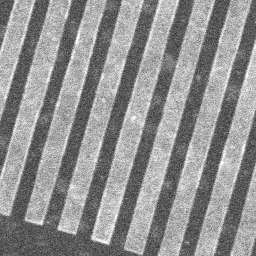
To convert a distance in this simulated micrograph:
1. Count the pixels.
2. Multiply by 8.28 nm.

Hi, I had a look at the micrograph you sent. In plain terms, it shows parallel lines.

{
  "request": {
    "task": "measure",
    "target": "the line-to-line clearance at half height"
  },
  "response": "134 nanometres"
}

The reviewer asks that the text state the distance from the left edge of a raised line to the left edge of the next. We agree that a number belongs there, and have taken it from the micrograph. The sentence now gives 286 nm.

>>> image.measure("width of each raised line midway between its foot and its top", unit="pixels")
18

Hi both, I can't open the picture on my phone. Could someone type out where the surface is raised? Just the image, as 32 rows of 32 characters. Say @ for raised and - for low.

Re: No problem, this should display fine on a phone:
--@@--@@@--@@--@@@--@@--@@@--@@-
--@@--@@@--@@--@@---@@--@@--@@@-
-@@@--@@--@@---@@--@@@--@@--@@@-
-@@--@@@--@@--@@@--@@--@@@--@@--
-@@--@@@--@@--@@@--@@--@@---@@--
@@@--@@--@@@--@@--@@@--@@--@@@--
@@--@@@--@@---@@--@@---@@--@@@--
@@--@@@--@@--@@@--@@--@@@--@@--@
@@--@@@-@@@--@@---@@--@@---@@--@
@@--@@--@@@--@@--@@@--@@--@@@--@
@--@@@--@@--@@@--@@--@@@--@@--@@
@--@@@--@@--@@---@@--@@---@@--@@
@--@@--@@@--@@--@@@--@@--@@@--@@
--@@@--@@@--@@--@@@--@@--@@---@@
--@@@--@@--@@@--@@--@@@--@@--@@@
--@@--@@@--@@--@@@--@@---@@--@@-
--@@--@@@--@@--@@@--@@--@@@--@@-
-@@@--@@--@@@--@@--@@@--@@--@@@-
-@@@--@@--@@---@@--@@---@@--@@@-
-@@--@@@--@@--@@@--@@--@@@--@@--
-@@--@@@--@@--@@@--@@--@@---@@--
@@@--@@--@@@--@@--@@@--@@--@@@--
@@--@@@--@@---@@--@@---@@--@@--@
@@--@@@--@@--@@@--@@--@@@--@@--@
@@--@@--@@@--@@--@@@--@@--@@@--@
@@--@@--@@---@@--@@---@@--@@---@
@--@@@--@@--@@@--@@--@@@--@@--@@
----@---@@--@@---@@--@@---@@--@@
-------@@@--@@--@@@--@@--@@@--@@
------------@@--@@--@@@--@@---@@
----------------@@--@@@--@@--@@@
-----------------@--@@--@@@--@@-